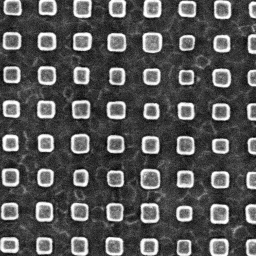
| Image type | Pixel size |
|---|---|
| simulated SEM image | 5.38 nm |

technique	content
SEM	a regular array of raised bodies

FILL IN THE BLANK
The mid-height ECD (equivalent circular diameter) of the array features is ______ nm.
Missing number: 92.4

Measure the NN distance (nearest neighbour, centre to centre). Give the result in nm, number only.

182